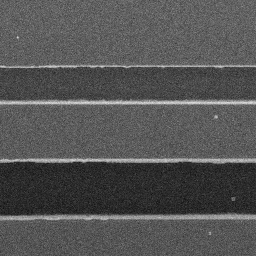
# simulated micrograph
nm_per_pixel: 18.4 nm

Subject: lines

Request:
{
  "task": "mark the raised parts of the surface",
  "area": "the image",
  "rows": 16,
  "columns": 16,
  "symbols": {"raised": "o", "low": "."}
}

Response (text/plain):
oooooooooooooooo
oooooooooooooooo
oooooooooooooooo
oooooooooooooooo
oooooooooooooooo
oooooooooooooooo
oooooooooooooooo
oooooooooooooooo
oooooooooooooooo
oooooooooooooooo
................
................
................
................
oooooooooooooooo
oooooooooooooooo